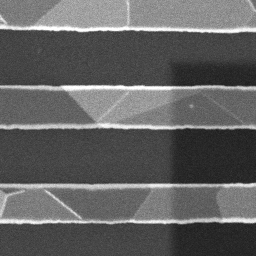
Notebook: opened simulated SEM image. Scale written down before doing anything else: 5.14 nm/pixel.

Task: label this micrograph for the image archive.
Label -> lines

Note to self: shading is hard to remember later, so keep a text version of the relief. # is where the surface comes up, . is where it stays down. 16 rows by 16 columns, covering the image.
################
################
................
................
................
################
################
################
................
................
................
................
################
################
................
................